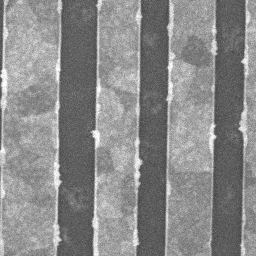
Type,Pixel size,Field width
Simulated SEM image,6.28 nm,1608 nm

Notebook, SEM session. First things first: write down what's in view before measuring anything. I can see one or a few lines or trenches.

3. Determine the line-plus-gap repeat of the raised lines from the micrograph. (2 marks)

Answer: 494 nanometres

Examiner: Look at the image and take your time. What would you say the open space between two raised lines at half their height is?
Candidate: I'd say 196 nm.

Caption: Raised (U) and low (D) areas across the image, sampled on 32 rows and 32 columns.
DUUUUUUUDDDDUUUUUUDDDUUUUUUDDDDU
DUUUUUUUDDDDUUUUUUDDDUUUUUUDDDDU
DUUUUUUUDDDDUUUUUUDDDUUUUUUDDDDU
DUUUUUUUDDDDUUUUUDDDDUUUUUUDDDDU
UUUUUUUUDDDDUUUUUDDDDUUUUUUDDDDU
DUUUUUUDDDDDUUUUUDDDDUUUUUUDDDDU
DUUUUUUDDDDDUUUUUDDDDUUUUUUDDDDU
UUUUUUUDDDDDUUUUUDDDDUUUUUUDDDUU
UUUUUUUDDDDDUUUUUDDDDUUUUUUDDDDU
UUUUUUUDDDDDUUUUUDDDDUUUUUUDDDDU
UUUUUUUDDDDDUUUUUDDDDUUUUUUDDDDU
UUUUUUUDDDDDUUUUUDDDDUUUUUUDDDDU
UUUUUUUDDDDDUUUUUDDDDUUUUUUDDDDU
UUUUUUUDDDDDUUUUUDDDDUUUUUUDDDDU
UUUUUUUDDDDDUUUUUDDDDUUUUUUDDDUU
UUUUUUUDDDDDUUUUUDDDDUUUUUUDDDUU
UUUUUUUDDDDDUUUUUDDDDUUUUUUDDDUU
UUUUUUUDDDDDUUUUUDDDDUUUUUUDDDUU
UUUUUUUDDDDDUUUUUDDDDUUUUUUDDDDU
UUUUUUUDDDDDUUUUUDDDDUUUUUUDDDDU
UUUUUUUDDDDDUUUUUUDDDUUUUUDDDDDU
UUUUUUUDDDDDUUUUUDDDDUUUUUDDDDDU
UUUUUUUDDDDDUUUUUDDDDUUUUUDDDDUU
UUUUUUUDDDDDUUUUUDDDDUUUUUDDDDUU
UUUUUUUDDDDDUUUUUDDDDUUUUUDDDDUU
UUUUUUUDDDDDUUUUUDDDDUUUUUDDDDUU
UUUUUUUDDDDDUUUUUDDDDUUUUUDDDDUU
UUUUUUUDDDDDUUUUUDDDDUUUUUDDDDUU
UUUUUUUDDDDDUUUUUDDDDUUUUUDDDDUU
UUUUUUUDDDDDUUUUUDDDDUUUUUDDDDUU
UUUUUUUDDDDDUUUUUDDDDUUUUUDDDDUU
UUUUUUUDDDDDUUUUUDDDDUUUUUDDDDUU